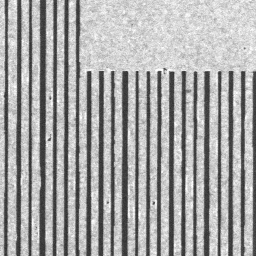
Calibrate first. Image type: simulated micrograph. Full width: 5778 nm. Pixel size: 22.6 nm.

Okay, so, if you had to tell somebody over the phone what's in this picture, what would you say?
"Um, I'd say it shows parallel lines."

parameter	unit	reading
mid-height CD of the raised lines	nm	166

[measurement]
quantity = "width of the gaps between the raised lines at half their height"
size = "93.1 nm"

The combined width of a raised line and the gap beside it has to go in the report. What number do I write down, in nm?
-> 268